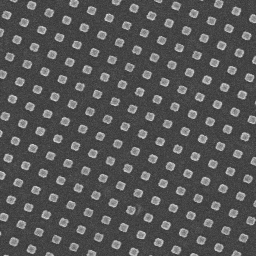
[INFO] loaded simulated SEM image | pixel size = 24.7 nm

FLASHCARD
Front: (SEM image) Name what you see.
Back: a regular array of raised bodies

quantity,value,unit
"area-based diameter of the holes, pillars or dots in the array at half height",210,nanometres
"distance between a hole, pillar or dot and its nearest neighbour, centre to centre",457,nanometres